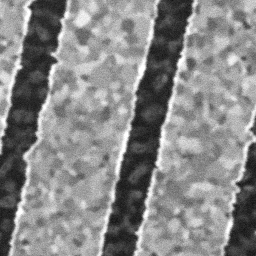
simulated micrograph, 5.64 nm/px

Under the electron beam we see one or a few lines or trenches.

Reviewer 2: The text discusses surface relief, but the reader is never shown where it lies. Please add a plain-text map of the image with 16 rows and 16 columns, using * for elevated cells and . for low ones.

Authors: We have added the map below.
**..******..****
**..******..****
*...*****...****
*...*****..*****
*..******..*****
*..******..*****
*..*****...*****
..******..******
..******..******
..******..*****.
..*****...*****.
..*****..******.
.******..******.
.******..*****..
.******..*****..
.*****...*****..